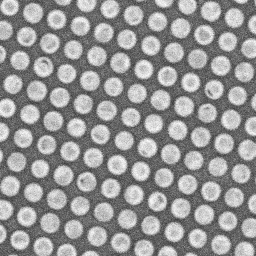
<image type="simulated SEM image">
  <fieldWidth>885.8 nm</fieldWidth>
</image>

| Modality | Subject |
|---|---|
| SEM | a regular array of raised bodies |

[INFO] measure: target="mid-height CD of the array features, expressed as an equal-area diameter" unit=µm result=0.0645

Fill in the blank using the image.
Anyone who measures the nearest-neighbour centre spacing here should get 83.6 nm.